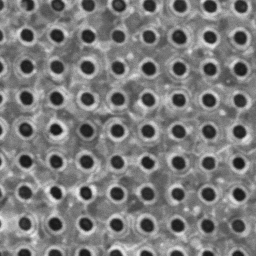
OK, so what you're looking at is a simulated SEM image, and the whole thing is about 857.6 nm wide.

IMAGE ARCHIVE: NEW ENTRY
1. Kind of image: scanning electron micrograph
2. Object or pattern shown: a regular array of holes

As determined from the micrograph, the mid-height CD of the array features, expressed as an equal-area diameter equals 49.9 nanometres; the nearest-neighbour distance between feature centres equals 0.101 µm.